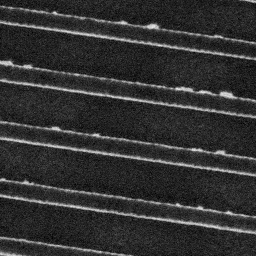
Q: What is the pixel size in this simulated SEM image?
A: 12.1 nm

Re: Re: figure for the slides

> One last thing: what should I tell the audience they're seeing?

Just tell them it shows lines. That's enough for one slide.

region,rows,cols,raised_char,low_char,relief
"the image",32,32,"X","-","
--------------------------------
XXXXXX--------------------------
XXXXXXXXXXXXX-------------------
-----XXXXXXXXXXXXXXX------------
------------XXXXXXXXXXXXXX------
-------------------XXXXXXXXXXXXX
-------------------------XXXXXXX
--------------------------------
XXXX----------------------------
XXXXXXXXXXX---------------------
---XXXXXXXXXXXXXXX--------------
----------XXXXXXXXXXXXXX--------
-----------------XXXXXXXXXXXXXX-
-----------------------XXXXXXXXX
------------------------------XX
XX------------------------------
XXXXXXXXX-----------------------
-XXXXXXXXXXXXXXX----------------
--------XXXXXXXXXXXXXX----------
--------------XXXXXXXXXXXXXXX---
---------------------XXXXXXXXXXX
----------------------------XXXX
--------------------------------
XXXXXXX-------------------------
XXXXXXXXXXXXXX------------------
-------XXXXXXXXXXXXXX-----------
--------------XXXXXXXXXXXXXX----
---------------------XXXXXXXXXXX
---------------------------XXXXX
--------------------------------
XXXXXX--------------------------
XXXXXXXXXXXXX-------------------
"